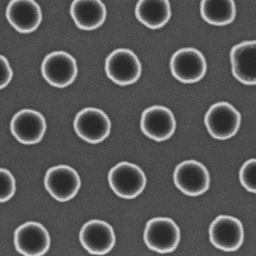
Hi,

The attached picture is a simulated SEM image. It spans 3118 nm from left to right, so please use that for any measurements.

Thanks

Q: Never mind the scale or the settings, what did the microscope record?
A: a regular array of raised bodies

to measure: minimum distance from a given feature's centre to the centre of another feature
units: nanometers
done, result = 784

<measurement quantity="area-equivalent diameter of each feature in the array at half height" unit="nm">415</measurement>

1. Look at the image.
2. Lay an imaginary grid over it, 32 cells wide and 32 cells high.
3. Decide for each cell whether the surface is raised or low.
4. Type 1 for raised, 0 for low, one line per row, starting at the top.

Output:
01110000011110000111100001111000
01111000011110000111100001111000
01111000011110000011100000111000
00110000001100000000000000000000
00000000000000000000000000000000
00000000000000000000000000000011
00000000000000110000001110000111
10000011100001111000011110000111
10000111100001111000011111000111
10000011100000111000001110000111
10000001100000010000000000000000
00000000000000000000000000000000
00000000000000000000000000000000
00000000000000000001000000111000
00111000001110000011100000111100
00111100011111000011110000111100
00111000001111000011110000111000
00111000000110000000000000000000
00000000000000000000000000000000
00000000000000000000000000000000
00000000000000010000000110000001
10000011100000111100001111000011
11000011110000111100001111000011
11000011110000111100001111000001
10000001100000011000000000000000
00000000000000000000000000000000
00000000000000000000000000000000
00000000000000000001100000011100
00111000001111000011110000111100
00111100001111000011110000111100
00111100001111000011110000011100
00011100000110000000100000000000